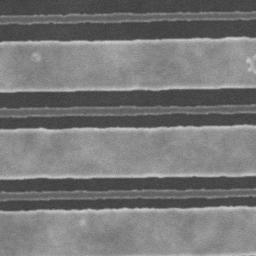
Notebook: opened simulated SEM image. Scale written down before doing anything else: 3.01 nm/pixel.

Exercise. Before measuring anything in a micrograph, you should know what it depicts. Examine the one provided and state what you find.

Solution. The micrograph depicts lines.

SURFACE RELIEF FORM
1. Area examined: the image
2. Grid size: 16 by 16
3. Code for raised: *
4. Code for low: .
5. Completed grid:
................
................
.........*******
****************
****************
**************..
................
................
****************
****************
****************
................
................
****************
****************
****************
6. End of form